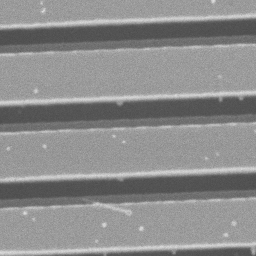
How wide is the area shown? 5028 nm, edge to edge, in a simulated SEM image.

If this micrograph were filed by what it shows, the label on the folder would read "lines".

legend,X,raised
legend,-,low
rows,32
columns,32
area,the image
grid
XXXXXXXXXXXXXXXXXXXXXXXXXXXXXXXX
XXXXXXXXXXXXXXXXXXXXXXXXXXXXXXXX
XXXXXXXXXXXXXXXXXXXXXXXXXX------
XXXXX---------------------------
--------------------------------
--------------------------------
---------XXXXXXXXXXXXXXXXXXXXXXX
XXXXXXXXXXXXXXXXXXXXXXXXXXXXXXXX
XXXXXXXXXXXXXXXXXXXXXXXXXXXXXXXX
XXXXXXXXXXXXXXXXXXXXXXXXXXXXXXXX
XXXXXXXXXXXXXXXXXXXXXXXXXXXXXXXX
XXXXXXXXXXXXXXXXXXXXXXXXXXXXXXXX
XXXXXXXXXXXXXXXXXX--------------
--------------------------------
--------------------------------
----------------------------XXXX
----XXXXXXXXXXXXXXXXXXXXXXXXXXXX
XXXXXXXXXXXXXXXXXXXXXXXXXXXXXXXX
XXXXXXXXXXXXXXXXXXXXXXXXXXXXXXXX
XXXXXXXXXXXXXXXXXXXXXXXXXXXXXXXX
XXXXXXXXXXXXXXXXXXXXXXXXXXXXXXXX
XXXXXXXXXXXXXXXXXXXXXXXXXXXXXXXX
XXXXXXXX------------------------
--------------------------------
--------------------------------
-----------XX--XXXXXXXXXXXXXXXXX
XXXXXXXXXXXXXXXXXXXXXXXXXXXXXXXX
XXXXXXXXXXXXXXXXXXXXXXXXXXXXXXXX
XXXXXXXXXXXXXXXXXXXXXXXXXXXXXXXX
XXXXXXXXXXXXXXXXXXXXXXXXXXXXXXXX
XXXXXXXXXXXXXXXXXXXXXXXXXXXXXXXX
XXXXXXXXXXXXXXXX----------------